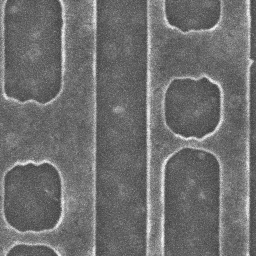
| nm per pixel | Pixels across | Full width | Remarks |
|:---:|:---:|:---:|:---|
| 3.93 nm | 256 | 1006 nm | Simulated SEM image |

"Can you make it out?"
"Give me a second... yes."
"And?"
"one or a few lines or trenches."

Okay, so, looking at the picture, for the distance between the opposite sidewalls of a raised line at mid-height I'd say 112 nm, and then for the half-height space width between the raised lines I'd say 206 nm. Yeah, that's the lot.